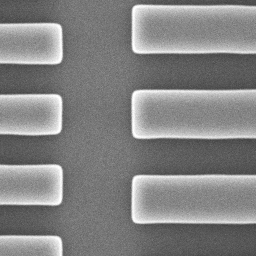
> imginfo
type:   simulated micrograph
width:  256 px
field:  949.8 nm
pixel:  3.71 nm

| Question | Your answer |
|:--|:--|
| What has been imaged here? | groups of lines, slits or small figures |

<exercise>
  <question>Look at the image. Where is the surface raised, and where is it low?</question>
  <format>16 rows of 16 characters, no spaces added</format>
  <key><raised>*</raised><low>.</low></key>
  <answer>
.........*******
........********
****....********
****............
................
................
****....********
****....********
.........*******
................
****............
****....********
****....********
........********
................
****............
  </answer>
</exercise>